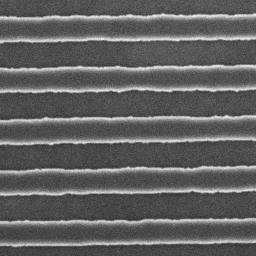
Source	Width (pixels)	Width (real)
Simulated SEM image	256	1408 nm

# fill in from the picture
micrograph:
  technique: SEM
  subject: lines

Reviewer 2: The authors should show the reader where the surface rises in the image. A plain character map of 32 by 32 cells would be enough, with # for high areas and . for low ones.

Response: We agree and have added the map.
................................
................................
################################
################################
################################
................................
................................
................................
.......#########.###############
################################
################################
#...............................
................................
................................
................................
################################
################################
############################...#
................................
................................
................................
################################
################################
################################
................................
................................
................................
..................##############
################################
################################
####################............
................................